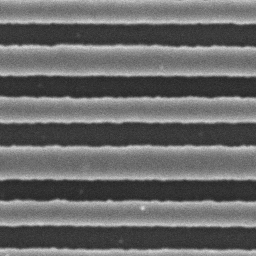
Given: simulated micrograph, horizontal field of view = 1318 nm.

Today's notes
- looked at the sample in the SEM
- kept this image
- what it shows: lines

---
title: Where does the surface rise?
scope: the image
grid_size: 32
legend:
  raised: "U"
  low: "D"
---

UUUUUUUUUUUUUUUUUUUUUUUUUUUUUUUU
UUUUUUUUUUUUUUUUUUUUUUUUUUUUUUUU
UUUUUUUUUUUUUUUUUUUUUUUUUUUUUUUU
DDDDDDDDDDDDDDDDDDDDDDDDDDDDDDDD
DDDDDDDDDDDDDDDDDDDDDDDDDDDDDDDD
DDDDDDDDDDDDDDDDDDDDDDDDDDDDDDDD
UUUUUUUUUUUUUUUUUUUUUUUUUUUUUUUU
UUUUUUUUUUUUUUUUUUUUUUUUUUUUUUUU
UUUUUUUUUUUUUUUUUUUUUUUUUUUUUUUU
DDDDDDDDDDDDDDDDDDDDDDDDDDDDDDDD
DDDDDDDDDDDDDDDDDDDDDDDDDDDDDDDD
DDDDDDDDDDDDDDDDDDDDDDDDDDDDDDDD
UUUUUUUUUUUUUUUUUUUUUUUUUUUUUUUU
UUUUUUUUUUUUUUUUUUUUUUUUUUUUUUUU
UUUUUUUUUUUUUUUUUUUUUUUUUUUUUUUU
DDDDDDDDDDDDDDDDDDDDDDDDDDDDDDDD
DDDDDDDDDDDDDDDDDDDDDDDDDDDDDDDD
DDDDDDDDDDDDDDDDDDDDDDDDDDDDDDDD
UUUUUUUUUUUUUUUUUUUUUUUUUUUUUUUU
UUUUUUUUUUUUUUUUUUUUUUUUUUUUUUUU
UUUUUUUUUUUUUUUUUUUUUUUUUUUUUUUU
UUUUUUUUUUUUUUUUUUUUUUUUUUUUUUUU
DDDDDDDDDDDDDDDDDDDDDDDDDDDDDDDD
DDDDDDDDDDDDDDDDDDDDDDDDDDDDDDDD
DDDDDDDDDDDDDDDDDDDDDDDDDDDDDDDD
UUUUUUUUUUUUUUUUUUUUUUUUUUUUUUUU
UUUUUUUUUUUUUUUUUUUUUUUUUUUUUUUU
UUUUUUUUUUUUUUUUUUUUUUUUUUUUUUUU
DDDDDDDDDDDDDDDDDDDDDDDDDDDDDDDD
DDDDDDDDDDDDDDDDDDDDDDDDDDDDDDDD
DDDDDDDDDDDDDDDDDDDDDDDDDDDDDDDD
UUUUUUUUUUUUUUUUUUUUUUUUUUUUUUUU